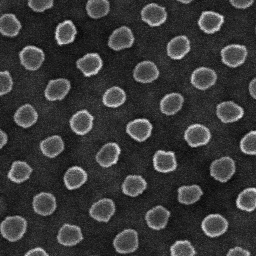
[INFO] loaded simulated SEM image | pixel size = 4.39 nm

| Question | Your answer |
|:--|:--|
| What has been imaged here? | a regular array of raised bodies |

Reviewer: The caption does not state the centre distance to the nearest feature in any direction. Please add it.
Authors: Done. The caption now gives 175 nm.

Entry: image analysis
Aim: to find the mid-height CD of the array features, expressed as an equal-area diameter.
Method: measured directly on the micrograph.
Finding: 99.4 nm